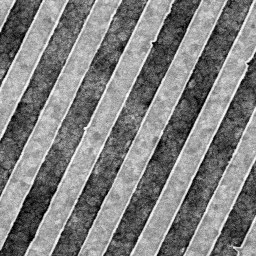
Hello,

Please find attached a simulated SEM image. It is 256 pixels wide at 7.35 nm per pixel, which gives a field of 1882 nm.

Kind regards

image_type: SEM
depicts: parallel lines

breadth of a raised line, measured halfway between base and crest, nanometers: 160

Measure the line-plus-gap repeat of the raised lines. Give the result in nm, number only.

350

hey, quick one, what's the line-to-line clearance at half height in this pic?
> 189 nm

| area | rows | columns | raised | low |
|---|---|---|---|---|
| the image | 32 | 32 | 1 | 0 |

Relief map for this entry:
11000111000011100011110001110000
10000111000111000011100001110001
10001110000111000111000011100001
00001110001110000111000011100011
00011100001110001111000111000011
00011100011100001110000111000111
00111000011100011110001110000111
00111000111100011100001110001110
01110000111000011100011100001110
01110001110000111000011100011100
11100001110001111000111000011100
11100011110001110000111000111000
11000011100001110001110000111000
11000011100011100001110001110000
10000111000011100011100001110001
10000111000111000011100011100001
00001110000111000111000011100001
00001110001110000111000111000011
00011100001110001110000111000011
00011100011100001110001110000111
00111000011100011100001110000111
00111000111000011100001100001110
01110000111000111000011100001110
01110001110000111000011100011100
11100001110001110000111000011100
11100011100001110000111000111000
11000011100011100001110000111000
11000111000011100001110001110000
10000111000111100011100001110001
10001110000111000011100011100001
00001110001111000111000011100011
00011100001110000111000111000011